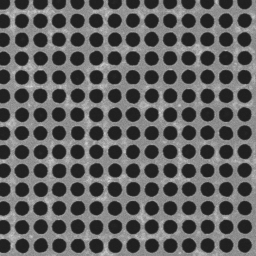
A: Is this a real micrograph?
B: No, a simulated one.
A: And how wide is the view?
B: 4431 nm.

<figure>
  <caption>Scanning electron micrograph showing a regular array of holes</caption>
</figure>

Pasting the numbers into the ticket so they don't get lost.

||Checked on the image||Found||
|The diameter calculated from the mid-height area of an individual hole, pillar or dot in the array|252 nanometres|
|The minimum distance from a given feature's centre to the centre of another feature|18.4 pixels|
